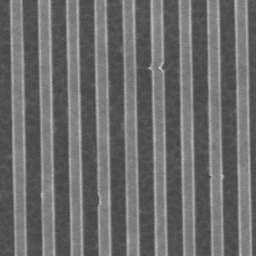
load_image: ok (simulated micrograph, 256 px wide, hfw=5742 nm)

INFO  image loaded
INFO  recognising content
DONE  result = parallel lines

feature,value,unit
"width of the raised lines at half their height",0.255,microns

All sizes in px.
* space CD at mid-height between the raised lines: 16.6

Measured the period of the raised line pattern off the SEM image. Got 28.1 px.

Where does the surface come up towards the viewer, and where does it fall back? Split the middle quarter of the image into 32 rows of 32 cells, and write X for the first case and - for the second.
-XXX----XXX----XXX----XX-----XXX
-XXX----XXX----XXX----XXX----XXX
-XXX----XXX----XXX----XXX----XXX
-XXX----XXX----XXX----XXX----XXX
-XXX----XXX----XXX----XXX----XXX
-XXX----XXX----XXX----XXX----XXX
-XXX----XXX----XXX----XXX----XXX
-XXX----XXX----XXX----XXX----XXX
-XXX----XXX----XXX----XXX----XXX
-XXX----XXX----XXX----XXX----XXX
-XXX----XXX----XXX----XXX----XXX
-XXX----XXX----XXX----XXX----XXX
-XXX----XXX----XXX----XXX----XXX
-XXX----XXX----XXX----XXX----XXX
-XXX----XXX----XXX----XXX----XXX
-XXX----XXX----XXX----XXX----XXX
-XXX----XXX----XXX----XXX----XXX
-XXX----XXX----XXX-----XX----XXX
-XXX----XXX----XXX-----XX----XXX
-XXX----XXX----XXX-----XX----XXX
-XXX----XXX----XXX-----XX----XXX
-XXX----XXX----XXX-----XX-----XX
-XXX-----XX-----XX-----XX-----XX
-XXX-----XX-----XX-----XX-----XX
-XXX-----XX-----XX-----XX-----XX
--XX-----XX-----XX-----XX-----XX
--XX-----XX-----XX-----XX-----XX
--XX-----XX-----XX-----XX-----XX
--XX-----XX-----XX-----XX-----XX
--XX-----XX-----XX-----XX-----XX
--XX-----XX-----XX-----XX-----XX
--XX-----XX-----XX-----XX-----XX